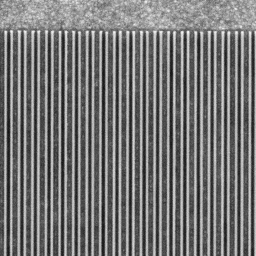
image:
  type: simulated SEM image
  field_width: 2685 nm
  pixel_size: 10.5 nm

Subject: parallel lines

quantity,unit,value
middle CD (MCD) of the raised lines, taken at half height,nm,26.2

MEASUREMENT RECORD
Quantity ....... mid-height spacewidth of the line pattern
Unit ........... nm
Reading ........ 44.6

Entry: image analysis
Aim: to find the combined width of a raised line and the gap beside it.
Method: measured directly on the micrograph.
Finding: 6.79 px